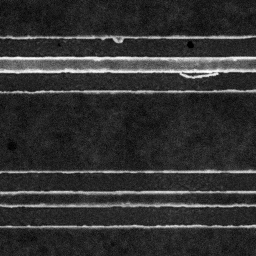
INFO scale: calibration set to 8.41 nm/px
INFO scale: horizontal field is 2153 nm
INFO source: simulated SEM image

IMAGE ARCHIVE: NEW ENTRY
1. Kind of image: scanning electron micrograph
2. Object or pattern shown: lines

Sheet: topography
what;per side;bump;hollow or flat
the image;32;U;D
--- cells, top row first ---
UUUUUUUUUUUUUUUUUUUUUUUUUUUUUUUU
UUUUUUUUUUUUUUUUUUUUUUUUUUUUUUUU
UUUUUUUUUUUUUUUUUUUUUUUUUUUUUUUU
UUUUUUUUUUUUUUUUUUUUUUUUUUUUUUUU
UUUUUUUUUUUUUUUUUUUUUUUUUUUUUUUU
DDDDDDDDDDDDDDDDDDDDDDDDDDDDDDDD
DDDDDDDDDDDDDDDDDDDDDDDDDDDDDDDD
UUUUUUUUUUUUUUUUUUUUUUUUUUUUUUUU
UUUUUUUUUUUUUUUUUUUUUUUUUUUUUUUU
DDDDDDDDDDDDDDDDDDDDDDDDDDDDDDDD
DDDDDDDDDDDDDDDDDDDDDDDDDDDDDDDD
UUUDUUUUUUUUUUUUUUUUUUUUUUUUUUUU
UUUUUUUUUUUUUUUUUUUUUUUUUUUUUUUU
UUUUUUUUUUUUUUUUUUUUUUUUUUUUUUUU
UUUUUUUUUUUUUUUUUUUUUUUUUUUUUUUU
UUUUUUUUUUUUUUUUUUUUUUUUUUUUUUUU
UUUUUUUUUUUUUUUUUUUUUUUUUUUUUUUU
UUUUUUUUUUUUUUUUUUUUUUUUUUUUUUUU
UUUUUUUUUUUUUUUUUUUUUUUUUUUUUUUU
UUUUUUUUUUUUUUUUUUUUUUUUUUUUUUUU
UUUUUUUUUUUUUUUUUUUUUUUUUUUUUUUU
DDDDDDDDUDDDDDDDDDDDDDDDDDDDDDDD
DDDDDDDDDDDDDDDDDDDDDDDDDDDDDDDD
DDDDDDDDDDDDDDDDDDDDDDDDDDDDDDDD
UUUUUUUUUUUUUUUUUUUUUUUUUUUUUUUU
UUUUUUUUUUUUUUUUUUUUUUUUUUUUUUUU
DDDDDDDDDDDDDDDDDDDDDDDDDDDDDDDD
DDDDDDDDDDDDDDDDDDDDDDDDDDDDDDDD
UUUUUUUUUUUUUUUUUUUUUUUUUUUUUUUU
UUUUUUUUUUUUUUUUUUUUUUUUUUUUUUUU
UUUUUUUUUUUUUUUUUUUUUUUUUUUUUUUU
UUUUUUUUUUUUUUUUUUUUUUUUUUUUUUUU